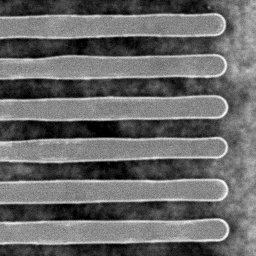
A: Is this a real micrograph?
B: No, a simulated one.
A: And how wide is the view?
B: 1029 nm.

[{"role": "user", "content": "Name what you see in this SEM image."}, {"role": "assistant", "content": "groups of lines, slits or small figures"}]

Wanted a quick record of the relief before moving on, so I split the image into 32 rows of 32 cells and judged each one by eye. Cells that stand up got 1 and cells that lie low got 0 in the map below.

00000000000000000000000000000000
00000000000000000000000000000000
11111111111111111111111111110000
11111111111111111111111111110000
11111111111110000000000000000000
00000000000000000000000000000000
00000000000000000000000000000000
11111111111111111111111111110000
11111111111111111111111111110000
11111111111111111111100011000000
00000000000000000000000000000000
00000000000000000000000000000000
00000111111111111111111111110000
11111111111111111111111111110000
11111111111111111111111111110000
00000000000000000000000000000000
00000000000000000000000000000000
00001111111111111111111111110000
11111111111111111111111111110000
11111111111111111111111111110000
00000000000000000000000000000000
00000000000000000000000000000000
00000000000000000000001111100000
11111111111111111111111111110000
11111111111111111111111111110000
00000000000000000000000000000000
00000000000000000000000000000000
00000000000000000000000001110000
11111111111111111111111111110000
11111111111111111111111111110000
00000000000000000000000000000000
00000000000000000000000000000000